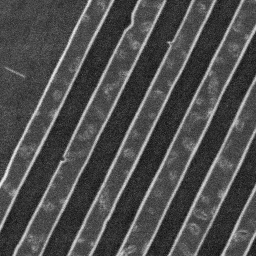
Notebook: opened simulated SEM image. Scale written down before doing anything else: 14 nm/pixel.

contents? parallel lines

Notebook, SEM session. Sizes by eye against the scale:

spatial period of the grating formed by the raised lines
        649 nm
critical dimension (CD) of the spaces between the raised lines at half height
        339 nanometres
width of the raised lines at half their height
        326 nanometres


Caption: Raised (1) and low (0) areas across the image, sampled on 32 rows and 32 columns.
00000000000111000111000011100011
00000000001110000111000111000011
00000000001110000111000111000111
00000000011100001110000110000111
00000000011100011110001110001110
00000000011000011100011100001110
00000000111000111100011100011100
00000000110000111000111000011100
00000001110001111000111000111000
00000001100001110001110000111000
00000011100011110001110001110000
00000011100011100001100001110001
00000111000111100011100011100001
00000111000111000011000011100011
00001110001111000111000111000011
00001110001110000110000111000111
00011100011110001110001111000111
00011000011100001100001110001110
00111000111100011100011110001110
00110000111000011000011100011110
01110000111000111000111100011100
01100001110000110000111000111100
11100001110001110001111000111000
11000011100001100001110001111000
11000011100011100011110001110001
10000111000011000011100011110001
10001111000111000111100011100011
10001110000110000111000111100011
00011110001110001111000111000111
00011100001110001110001111000111
00111100011100011110001110001110
00111000011100011100011110001110